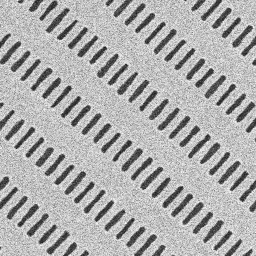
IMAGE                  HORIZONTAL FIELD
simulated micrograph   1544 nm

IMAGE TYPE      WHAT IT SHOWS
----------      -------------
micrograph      a regular array of holes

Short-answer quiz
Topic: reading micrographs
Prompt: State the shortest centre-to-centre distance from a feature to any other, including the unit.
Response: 80.4 nm